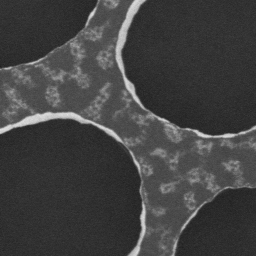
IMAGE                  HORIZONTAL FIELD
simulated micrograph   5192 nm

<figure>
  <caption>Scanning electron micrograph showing holes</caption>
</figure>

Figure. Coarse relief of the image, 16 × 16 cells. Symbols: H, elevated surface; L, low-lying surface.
LLLLLLHHLLLLLLLL
LLLLLHHHLLLLLLLL
LLLLHHHLLLLLLLLL
LLLHHHHLLLLLLLLL
HHHHHHHHLLLLLLLL
HHHHHHHHLLLLLLLL
HHHHHHHHHLLLLLLL
HHHLLHHHHHLLLLLL
LLLLLLLHHHHHHHHH
LLLLLLLLHHHHHHHH
LLLLLLLLLHHHHHHH
LLLLLLLLLHHHHHHH
LLLLLLLLLHHHHLLL
LLLLLLLLLHHHLLLL
LLLLLLLLLHHLLLLL
LLLLLLLLLHHLLLLL